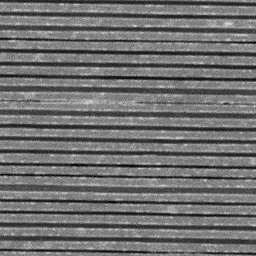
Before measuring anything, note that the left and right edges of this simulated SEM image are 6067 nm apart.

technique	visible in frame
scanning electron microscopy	parallel lines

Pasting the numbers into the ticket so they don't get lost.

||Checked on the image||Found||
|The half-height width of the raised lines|198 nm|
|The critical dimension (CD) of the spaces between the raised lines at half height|110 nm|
